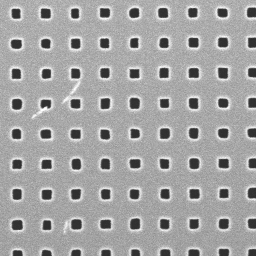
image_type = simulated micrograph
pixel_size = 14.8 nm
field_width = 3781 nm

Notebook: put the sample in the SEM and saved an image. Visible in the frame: a regular array of holes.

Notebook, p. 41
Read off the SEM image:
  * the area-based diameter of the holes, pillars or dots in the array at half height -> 11.1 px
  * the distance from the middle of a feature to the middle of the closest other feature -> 0.433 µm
